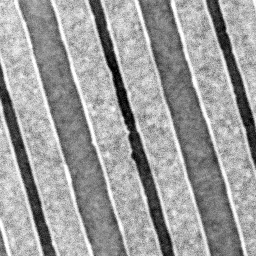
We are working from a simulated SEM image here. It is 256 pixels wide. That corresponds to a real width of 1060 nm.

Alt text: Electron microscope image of parallel lines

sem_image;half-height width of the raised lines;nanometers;133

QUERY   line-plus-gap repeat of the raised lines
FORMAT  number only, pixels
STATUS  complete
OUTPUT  57.9